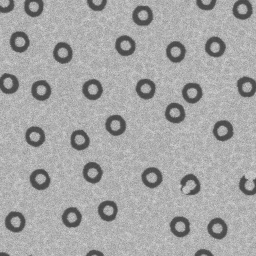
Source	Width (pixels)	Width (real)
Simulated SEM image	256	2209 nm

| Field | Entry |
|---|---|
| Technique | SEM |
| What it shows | a regular array of ring-shaped grooves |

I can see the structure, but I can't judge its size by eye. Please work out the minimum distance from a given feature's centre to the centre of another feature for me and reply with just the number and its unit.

336 nm